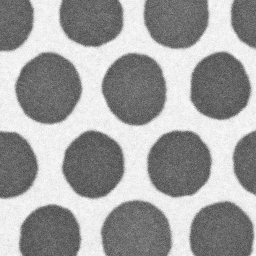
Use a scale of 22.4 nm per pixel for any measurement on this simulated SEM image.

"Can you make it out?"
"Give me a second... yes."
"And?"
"holes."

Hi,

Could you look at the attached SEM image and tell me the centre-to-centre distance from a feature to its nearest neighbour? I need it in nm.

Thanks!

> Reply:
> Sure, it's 1920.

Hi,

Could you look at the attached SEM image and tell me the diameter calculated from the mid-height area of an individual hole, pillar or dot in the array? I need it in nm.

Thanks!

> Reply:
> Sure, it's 1500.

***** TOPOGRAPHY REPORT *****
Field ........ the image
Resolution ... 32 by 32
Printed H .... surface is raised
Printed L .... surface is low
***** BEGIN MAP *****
LLLLHHHHLLLLLLLHHHLLLLLLLLHHHLLL
LLLLHHHLLLLLLLLHHHLLLLLLLLHHHLLL
LLLLHHHLLLLLLLLLHHLLLLLLLLHHHLLL
LLLLHHHHLLLLLLLHHHLLLLLLLLHHHLLL
LLLLHHHHLLLLLLLHHHHLLLLLLHHHHHLL
LLLHHHHHHHLLLHHHHHHHLLLLHHHHHHHL
LHHHHLHHHHHHHHHHHHHHHHHHHHHLHHHH
HHHHLLLLLHHHHHLLLLLHHHHHHLLLLLHH
HHHLLLLLLLHHHHLLLLLLHHHHLLLLLLLH
HHLLLLLLLLHHHLLLLLLLHHHHLLLLLLLH
HHLLLLLLLLHHHLLLLLLLLHHHLLLLLLLH
HHLLLLLLLLHHHLLLLLLLLHHHLLLLLLLH
HHLLLLLLLLHHHLLLLLLLLHHHLLLLLLLH
HHHLLLLLLHHHHHLLLLLLLHHHLLLLLLLH
HHHLLLLLLHHHHHLLLLLLHHHHHHLLLLHH
HHHHHHLHHHHHHHHHLLHHHHHHHHHHHHHH
LLHHHHHHHHLLLHHHHHHHHLLLHHHHHHHL
LLLHHHHHHLLLLLHHHHHHLLLLLHHHHHLL
LLLLHHHHLLLLLLLHHHHLLLLLLLHHHLLL
LLLLLHHHLLLLLLLLHHLLLLLLLLHHHLLL
LLLLLHHHLLLLLLLLHHLLLLLLLLHHHLLL
LLLLLHHHLLLLLLLLHHLLLLLLLLHHHLLL
LLLLHHHHLLLLLLLHHHHLLLLLLLHHHHLL
LLLLHHHHHLLLLLHHHHHLLLLLLHHHHHLL
LLHHHHHHHHLLLHHHHHHHHLLLHHHHHHHH
HHHHHHHHHHHHHHHLLLLHHHHHHHLLLHHH
HHHHLLLLLHHHHHLLLLLLHHHHHLLLLLLH
HHHLLLLLLLHHHLLLLLLLLHHHLLLLLLLH
HHHLLLLLLLHHHLLLLLLLLHHHLLLLLLLL
HHLLLLLLLLHHHLLLLLLLLHHHLLLLLLLL
HHLLLLLLLLHHHLLLLLLLLLHHLLLLLLLL
HHHLLLLLLLHHHLLLLLLLLHHHLLLLLLLL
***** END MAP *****